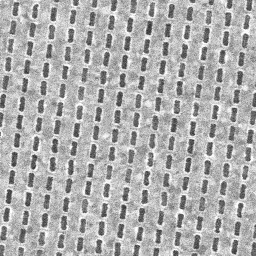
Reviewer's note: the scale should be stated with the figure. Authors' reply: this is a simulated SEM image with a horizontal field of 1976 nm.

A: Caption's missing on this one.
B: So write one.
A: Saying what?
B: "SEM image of a regular array of holes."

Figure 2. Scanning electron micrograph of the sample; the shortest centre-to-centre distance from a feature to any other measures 0.142 µm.